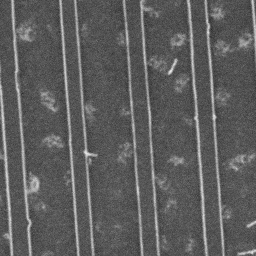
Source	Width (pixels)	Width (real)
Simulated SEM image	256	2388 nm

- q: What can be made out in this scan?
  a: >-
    one or a few lines or trenches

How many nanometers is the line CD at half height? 152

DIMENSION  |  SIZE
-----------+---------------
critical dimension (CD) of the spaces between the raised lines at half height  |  448 nm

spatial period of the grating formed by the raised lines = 602 nm